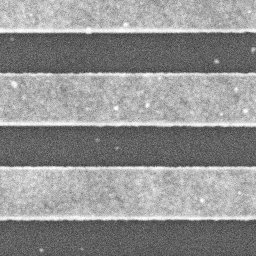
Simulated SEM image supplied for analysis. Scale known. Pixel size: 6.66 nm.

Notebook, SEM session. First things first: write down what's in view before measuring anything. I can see lines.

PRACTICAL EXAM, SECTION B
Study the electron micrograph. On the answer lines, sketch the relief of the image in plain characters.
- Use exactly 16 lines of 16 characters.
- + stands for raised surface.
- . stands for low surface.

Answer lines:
++++++++++++++++
++++++++++++++++
................
................
................
++++++++++++++++
++++++++++++++++
++++++++++++++++
................
................
++++++++++++++++
++++++++++++++++
++++++++++++++++
++++++++++++++++
................
................